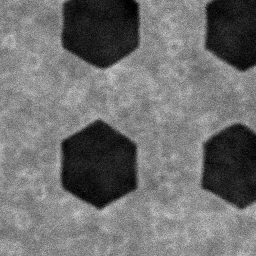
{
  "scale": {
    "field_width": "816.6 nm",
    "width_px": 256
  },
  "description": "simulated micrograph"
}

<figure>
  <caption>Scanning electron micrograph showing holes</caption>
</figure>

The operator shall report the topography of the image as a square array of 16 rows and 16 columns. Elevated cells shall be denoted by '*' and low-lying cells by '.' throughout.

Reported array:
****.....****...
****.....****...
****.....****...
*****...*****...
****************
****************
****************
****************
****....*****...
****.....****...
****.....****...
****.....****...
*****..*******..
****************
****************
****************